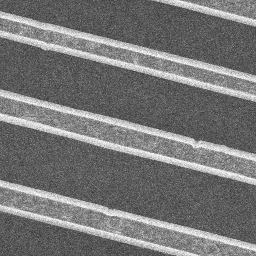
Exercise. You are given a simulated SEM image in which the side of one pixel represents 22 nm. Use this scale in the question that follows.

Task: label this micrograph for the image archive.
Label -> one or a few lines or trenches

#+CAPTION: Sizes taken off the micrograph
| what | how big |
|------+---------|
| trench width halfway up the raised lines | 1.24 µm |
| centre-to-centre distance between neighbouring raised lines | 1800 nanometers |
